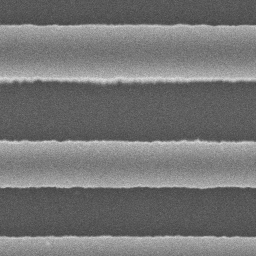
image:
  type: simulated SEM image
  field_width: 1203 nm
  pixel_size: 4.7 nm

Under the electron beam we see lines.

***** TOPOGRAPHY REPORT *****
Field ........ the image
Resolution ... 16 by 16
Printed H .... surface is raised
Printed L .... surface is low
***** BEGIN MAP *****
LLLLLLLLLLLLLLLL
LLLLLLLLLLLLLLLL
HHHHHHHHHHHHHHHH
HHHHHHHHHHHHHHHH
HHHHHHHHHHHHHHHH
LLLLLLLLLLLLLLLL
LLLLLLLLLLLLLLLL
LLLLLLLLLLLLLLLL
LLLLLLLLLLLLLLLL
HHHHHHHHHHHHHHHH
HHHHHHHHHHHHHHHH
HHHHHHHHHHHHHHHH
LLLLLLLLLLLLLLLL
LLLLLLLLLLLLLLLL
LLLLLLLLLLLLLLLL
HHHHHHHHHHHHHHHH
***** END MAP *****